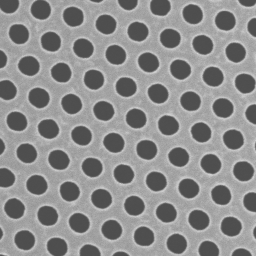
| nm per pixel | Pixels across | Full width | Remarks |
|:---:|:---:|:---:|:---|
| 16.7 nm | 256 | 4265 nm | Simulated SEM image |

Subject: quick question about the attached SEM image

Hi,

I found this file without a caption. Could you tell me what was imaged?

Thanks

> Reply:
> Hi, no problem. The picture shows a regular array of holes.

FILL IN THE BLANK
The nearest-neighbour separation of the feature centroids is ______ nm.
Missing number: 544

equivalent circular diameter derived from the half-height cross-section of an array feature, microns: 0.343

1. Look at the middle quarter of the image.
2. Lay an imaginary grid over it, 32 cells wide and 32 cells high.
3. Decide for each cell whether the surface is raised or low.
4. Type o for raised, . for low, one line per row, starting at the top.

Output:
.oooooooooooooooooo.....ooo.....
..oooo..oooooooooooo...ooo......
..ooo.....ooooooooooooooooo.....
..ooo.....oooo..oooooooooooo..oo
.oooo.....ooo.....oooooooooooooo
oooooo...oooo.....oooo...ooooooo
ooooooooooooo.....ooo.....oooooo
o.oooooooooooo....ooo.....oooo..
....ooooooooooooooooo.....ooo...
....ooooo..ooooooooooo...oooo...
.....oo.....ooooooooooooooooo...
....ooo......ooo...ooooooooooo..
o..ooooo.....ooo....oooooooooooo
oooooooo....ooo......ooo....oooo
oooooooooooooooo.....ooo....oooo
oooo.ooooooooooo....ooo......ooo
oo....oooooooooooooooooo.....ooo
oo.....oooo...ooooooooooo...oooo
oo.....ooo.....ooooooooooooooooo
ooo....ooo.....oooo...oooooooooo
oooooooooo.....ooo.....ooooooooo
ooooooooooo....ooo.....oooo...oo
.ooooooooooooooooo.....ooo.....o
.ooooo..ooooooooooo...oooo.....o
.oooo....oooooooooooooooooo....o
.ooo......ooo...oooooooooooo..oo
ooooo.....oo.....ooooooooooooooo
ooooo....ooo......ooo....ooooooo
ooooooooooooo....oooo....ooooooo
..ooooooooooo....ooo......ooo...
...oooooooooooooooooo.....ooo...
....oooo..oooooooooooo...oooo...